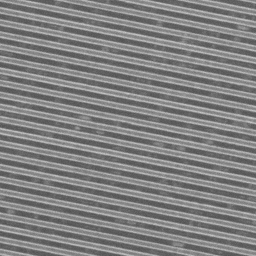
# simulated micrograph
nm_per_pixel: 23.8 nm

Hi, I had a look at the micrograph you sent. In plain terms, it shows parallel lines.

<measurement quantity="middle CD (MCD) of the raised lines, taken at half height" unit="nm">117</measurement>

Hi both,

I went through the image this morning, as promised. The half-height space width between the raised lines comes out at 0.175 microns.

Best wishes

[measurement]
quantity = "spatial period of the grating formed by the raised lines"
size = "282 nanometres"